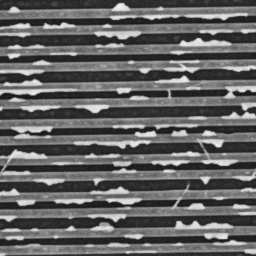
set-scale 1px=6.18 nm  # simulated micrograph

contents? parallel lines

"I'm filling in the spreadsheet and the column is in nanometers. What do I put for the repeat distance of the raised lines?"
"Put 112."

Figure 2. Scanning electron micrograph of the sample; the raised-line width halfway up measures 60.2 nanometres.